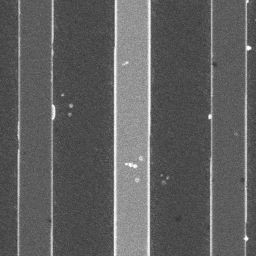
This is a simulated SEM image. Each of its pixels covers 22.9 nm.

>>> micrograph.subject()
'lines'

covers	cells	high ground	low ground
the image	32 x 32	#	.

..#####.......#####.......#####.
..#####.......#####.......#####.
..#####.......#####.......#####.
..#####.......#####.......#####.
..#####.......#####.......#####.
..####........#####.......#####.
..####........#####.......#####.
..####........#####.......#####.
..####........#####.......#####.
..####........#####.......#####.
..####........#####.......#####.
..####........#####.......#####.
..####........#####.......#####.
..#####.......#####.......#####.
..#####.......#####.......#####.
..####........#####.......#####.
..####........#####.......#####.
..####........#####.......#####.
..####........#####.......#####.
..####........#####.......#####.
..####........#####.......#####.
..####........#####.......#####.
..####........#####.......#####.
..####........#####.......#####.
..####........#####.......#####.
..####........#####.......#####.
..####........#####.......#####.
..####........#####.......#####.
..####........#####.......#####.
..####........#####.......#####.
..####........#####.......#####.
..####........#####.......#####.